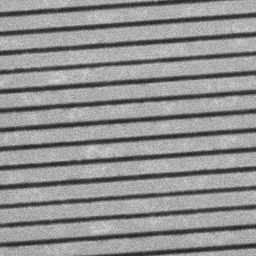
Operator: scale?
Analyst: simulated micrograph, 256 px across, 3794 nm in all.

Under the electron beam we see parallel lines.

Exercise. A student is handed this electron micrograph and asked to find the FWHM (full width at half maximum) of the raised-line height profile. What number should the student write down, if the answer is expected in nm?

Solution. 192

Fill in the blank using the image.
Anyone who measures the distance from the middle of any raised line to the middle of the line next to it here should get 0.284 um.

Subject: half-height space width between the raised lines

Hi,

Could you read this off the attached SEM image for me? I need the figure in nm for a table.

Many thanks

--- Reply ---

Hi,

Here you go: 88.7